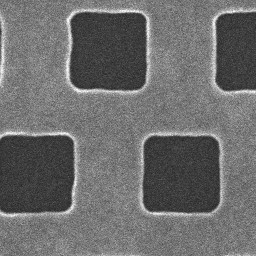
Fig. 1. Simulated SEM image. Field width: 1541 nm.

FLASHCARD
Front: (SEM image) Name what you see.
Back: holes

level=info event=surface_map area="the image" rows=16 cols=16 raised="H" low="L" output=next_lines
HHHHHHHHHHHHHHHH
HHHHLLLLLHHHHHLL
HHHHLLLLLHHHHHLL
HHHHLLLLLHHHHHLL
HHHHLLLLLHHHHHLL
HHHHHLLLLHHHHHLL
HHHHHHHHHHHHHHHH
HHHHHHHHHHHHHHHH
LLLLHHHHHHLLLHHH
LLLLLHHHHLLLLLHH
LLLLLHHHHLLLLLHH
LLLLLHHHHLLLLLHH
LLLLHHHHHLLLLLHH
HHHHHHHHHHHHHHHH
HHHHHHHHHHHHHHHH
HHHHHHHHHHHHHHHH